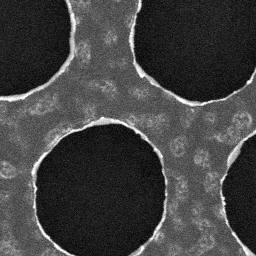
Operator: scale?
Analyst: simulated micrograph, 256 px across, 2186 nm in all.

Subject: holes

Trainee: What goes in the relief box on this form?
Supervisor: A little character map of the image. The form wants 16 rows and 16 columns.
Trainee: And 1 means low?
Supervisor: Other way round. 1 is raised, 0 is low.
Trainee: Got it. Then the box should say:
0000111110000000
0000011100000000
0000011100000000
0000111100000000
0000111110000000
0011111111000001
1111111111111111
1111111111111111
1111000001111111
1110000000111110
1100000000111100
1100000000111100
1100000000111100
1100000000111100
1110000000111110
1111000001111110